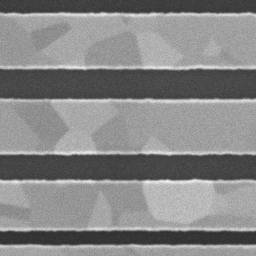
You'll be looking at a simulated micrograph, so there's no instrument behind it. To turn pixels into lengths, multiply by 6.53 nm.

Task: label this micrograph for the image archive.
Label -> lines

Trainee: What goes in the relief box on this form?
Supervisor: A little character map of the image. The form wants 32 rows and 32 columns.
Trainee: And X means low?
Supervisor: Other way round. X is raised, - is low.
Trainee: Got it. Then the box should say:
--------------------------------
--------------------------------
XXXXXXXXXXXXXXXXXXXXXXXXXXXXXXXX
XXXXXXXXXXXXXXXXXXXXXXXXXXXXXXXX
XXXXXXXXXXXXXXXXXXXXXXXXXXXXXXXX
XXXXXXXXXXXXXXXXXXXXXXXXXXXXXXXX
XXXXXXXXXXXXXXXXXXXXXXXXXXXXXXXX
XXXXXXXXXXXXXXXXXXXXXXXXXXXXXXXX
XXXXXXXXXXXXXXXXXXXXXXXXXXXXXXXX
--------------------------------
--------------------------------
--------------------------------
XX---X--X----XX-X-X------------X
XXXXXXXXXXXXXXXXXXXXXXXXXXXXXXXX
XXXXXXXXXXXXXXXXXXXXXXXXXXXXXXXX
XXXXXXXXXXXXXXXXXXXXXXXXXXXXXXXX
XXXXXXXXXXXXXXXXXXXXXXXXXXXXXXXX
XXXXXXXXXXXXXXXXXXXXXXXXXXXXXXXX
XXXXXXXXXXXXXXXXXXXXXXXXXXXXXXXX
--------------------------------
--------------------------------
--------------------------------
------------------------X-------
XXXXXXXXXXXXXXXXXXXXXXXXXXXXXXXX
XXXXXXXXXXXXXXXXXXXXXXXXXXXXXXXX
XXXXXXXXXXXXXXXXXXXXXXXXXXXXXXXX
XXXXXXXXXXXXXXXXXXXXXXXXXXXXXXXX
XXXXXXXXXXXXXXXXXXXXXXXXXXXXXXXX
XXXXXXXXXXXXXXXXXXXXXXXXXXXXXXXX
--------------------------------
--------------------------------
XXXXXXXXXXXXXXXXXXXXXXXXXXXXXXXX